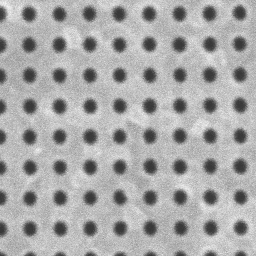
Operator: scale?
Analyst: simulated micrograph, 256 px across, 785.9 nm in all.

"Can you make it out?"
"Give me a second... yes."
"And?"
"a regular array of holes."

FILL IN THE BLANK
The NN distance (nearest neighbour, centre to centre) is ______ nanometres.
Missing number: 92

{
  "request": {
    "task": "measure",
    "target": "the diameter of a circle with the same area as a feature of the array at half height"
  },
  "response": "46.5 nanometres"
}